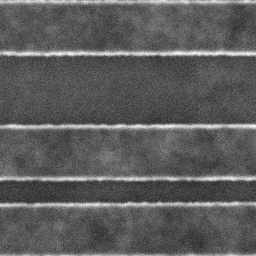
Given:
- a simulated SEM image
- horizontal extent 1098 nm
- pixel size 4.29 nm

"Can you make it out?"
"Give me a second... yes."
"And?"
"lines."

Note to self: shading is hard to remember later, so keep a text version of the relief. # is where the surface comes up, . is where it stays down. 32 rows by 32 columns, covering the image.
################################
################################
################################
################################
################################
################################
################################
................................
................................
................................
................................
................................
................................
................................
................................
................................
################################
################################
################################
################################
################################
################################
#.##.########.######.#.####..###
................................
................................
################################
################################
################################
################################
################################
################################
################################